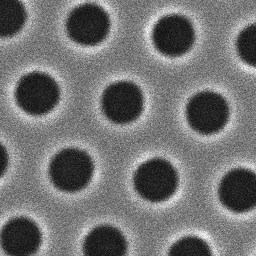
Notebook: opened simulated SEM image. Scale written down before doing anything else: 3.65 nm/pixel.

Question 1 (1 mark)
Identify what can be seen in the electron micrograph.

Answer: holes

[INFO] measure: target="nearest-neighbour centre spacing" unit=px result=84.2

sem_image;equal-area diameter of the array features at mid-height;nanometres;167